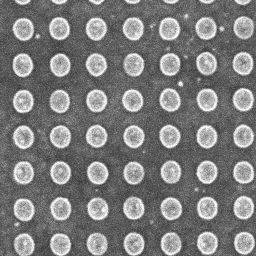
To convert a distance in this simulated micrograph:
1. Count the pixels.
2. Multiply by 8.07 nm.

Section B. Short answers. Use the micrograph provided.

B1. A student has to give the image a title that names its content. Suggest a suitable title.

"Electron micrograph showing a regular array of raised bodies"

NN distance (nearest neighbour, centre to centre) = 287 nm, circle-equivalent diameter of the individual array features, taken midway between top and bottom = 163 nm